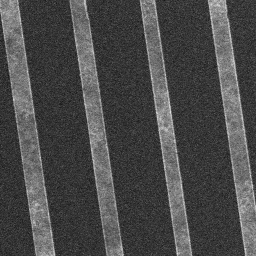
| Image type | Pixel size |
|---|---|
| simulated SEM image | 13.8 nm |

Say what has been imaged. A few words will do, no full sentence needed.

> one or a few lines or trenches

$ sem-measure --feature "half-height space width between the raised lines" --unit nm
739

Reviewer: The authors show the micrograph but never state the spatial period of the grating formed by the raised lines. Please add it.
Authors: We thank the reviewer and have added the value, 949 nanometers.